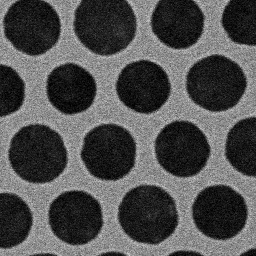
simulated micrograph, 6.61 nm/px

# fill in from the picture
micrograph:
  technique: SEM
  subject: a regular array of holes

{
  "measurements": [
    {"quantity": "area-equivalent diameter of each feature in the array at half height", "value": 56.3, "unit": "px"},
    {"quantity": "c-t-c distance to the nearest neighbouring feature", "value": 477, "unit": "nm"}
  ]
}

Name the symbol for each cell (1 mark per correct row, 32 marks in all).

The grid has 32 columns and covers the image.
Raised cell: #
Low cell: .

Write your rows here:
##....####......####.....###....
#......##........##......###....
........#........##.......##....
........#........##......###....
#......###.......##......###....
#......###......####....######..
###...#####....#################
#########################....###
.######...#####.....####......##
...###......###......##........#
...###......##.......##........#
...###......###......##........#
...###......###......###......##
..#####....#####....#####....###
.###############################
####.########.#######...#####...
##.....####.....####.....####...
#.......##.......##.......##....
#.......##.......##.......##....
#.......##.......##.......##....
#.......##.......###......###...
##......###.....#####....#####..
###....######..#################
#################...######...###
..#####.....####.....####.....##
...###......###.......##.......#
....##.......##.......##.......#
....##.......##.......##.......#
....##.......##.......###.....##
...####.....####.....#####...###
...#####...#######..############
#############..#######...#####..